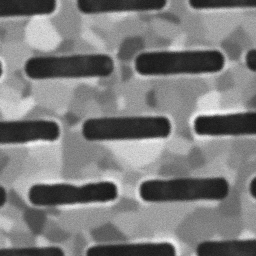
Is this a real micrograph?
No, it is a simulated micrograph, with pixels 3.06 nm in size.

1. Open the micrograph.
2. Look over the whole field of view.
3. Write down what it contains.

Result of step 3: holes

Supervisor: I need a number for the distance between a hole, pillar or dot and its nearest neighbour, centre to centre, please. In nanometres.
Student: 258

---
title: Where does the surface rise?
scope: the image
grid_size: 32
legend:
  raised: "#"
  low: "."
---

.......###...........###........
.......###......################
################################
################################
################################
################################
####################........###.
####..........###...........###.
###...........###...........###.
####..........##################
################################
################################
################################
################################
################....#####.......
.......###...........###........
.......###...........###........
.......####.....################
################################
################################
################################
################################
##################..#.......###.
.###...........##............##.
.##............###..........###.
.###.....#######################
################################
################################
################################
################################
##############.......####.......
........###...........###.......